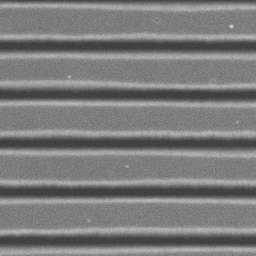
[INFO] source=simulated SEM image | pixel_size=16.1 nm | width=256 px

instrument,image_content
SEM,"lines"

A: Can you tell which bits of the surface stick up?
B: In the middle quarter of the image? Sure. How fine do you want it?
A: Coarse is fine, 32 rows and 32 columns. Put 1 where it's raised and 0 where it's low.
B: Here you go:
11111111111111111111111111111111
11111111111111111111111111111111
11111111111111111111111111111111
11111111111111111111111111111111
11111111111111111111111111111111
11111111111111111111111111111111
00000000000000000000000000000000
00000000000000000000000000000000
00000000000000000000000000000000
11111111111111111111111111111111
11111111111111111111111111111111
11111111111111111111111111111111
11111111111111111111111111111111
11111111111111111111111111111111
11111111111111111111111111111111
11111111111111111111111111111111
11111111111111111111111111111111
11111111111111111111111111111111
00000000000000000000000000011000
00000000000000000000000000000000
00000000000000000000000000000000
11111111111111111111111111111111
11111111111111111111111111111111
11111111111111111111111111111111
11111111111111111111111111111111
11111111111111111111111111111111
11111111111111111111111111111111
11111111111111111111111111111111
11111111111111111111111111111111
11111111111111111111111111111111
11111111111111111111111111111111
00000000000000000000000000000000